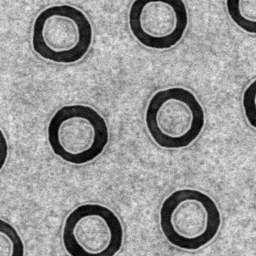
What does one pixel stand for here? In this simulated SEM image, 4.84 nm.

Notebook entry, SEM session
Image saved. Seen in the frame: ring-shaped grooves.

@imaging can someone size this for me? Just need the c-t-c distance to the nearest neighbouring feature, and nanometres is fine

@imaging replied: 477